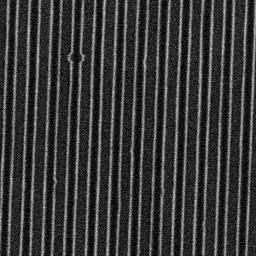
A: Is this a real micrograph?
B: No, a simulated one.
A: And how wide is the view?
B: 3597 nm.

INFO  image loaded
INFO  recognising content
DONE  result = parallel lines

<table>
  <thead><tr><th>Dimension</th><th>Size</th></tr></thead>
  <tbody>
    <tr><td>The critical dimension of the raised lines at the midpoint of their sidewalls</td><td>144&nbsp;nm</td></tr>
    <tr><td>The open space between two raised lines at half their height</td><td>156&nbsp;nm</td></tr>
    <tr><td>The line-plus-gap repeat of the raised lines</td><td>304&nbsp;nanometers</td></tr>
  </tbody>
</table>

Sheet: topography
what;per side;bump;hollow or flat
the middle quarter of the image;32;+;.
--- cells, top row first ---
..++...+++...++...++...+++...++.
..++...+++...++...++...+++...++.
..++...++...+++...++...++....++.
..++...++...+++...++...++....++.
..++...++...+++...++...++....++.
..++...++...+++...++...++...+++.
..++...++...+++...++...+++..+++.
..++...++...+++...++...+++..+++.
..++...++...+++...++...+++..+++.
..++...++...+++...++...++...+++.
.+++...++...+++...++...++...+++.
.+++...++...++...+++...++...+++.
.+++...++...++...+++...++...+++.
.+++...++...++...+++...++...+++.
.+++...++...++...+++...++...+++.
.+++...++...++...+++...++...+++.
.+++...++...++...+++...++...+++.
.+++...++...++...+++...++...+++.
.+++...++...++...+++...++...++..
.+++...++...++...+++...++...++..
.++...+++...++...++....++...++..
.++...+++...++...++...+++...++..
.++...+++...++...++...+++...++..
.++...+++...++...++...+++...++..
.++...+++...++...++....++...++..
.++...+++...++...++....++...++..
.++...+++...++...++....++...++..
.++...+++...++...++...+++...++..
.++...+++...++...++...+++...++..
.++...++...+++...++...+++...++..
.++...++...+++...++...++....++..
.++...++...+++...++...+++...++..